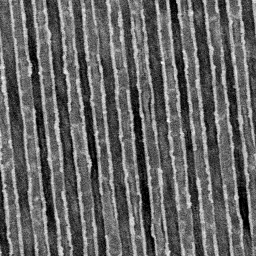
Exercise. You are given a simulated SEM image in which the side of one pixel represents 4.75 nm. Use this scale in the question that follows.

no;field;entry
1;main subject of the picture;parallel lines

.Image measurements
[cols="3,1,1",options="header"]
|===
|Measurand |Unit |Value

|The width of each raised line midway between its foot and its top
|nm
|65.6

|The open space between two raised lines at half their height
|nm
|46.6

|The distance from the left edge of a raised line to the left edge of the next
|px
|24.2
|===